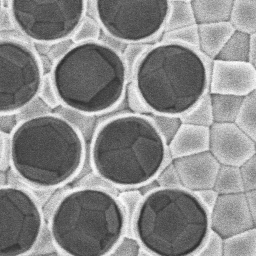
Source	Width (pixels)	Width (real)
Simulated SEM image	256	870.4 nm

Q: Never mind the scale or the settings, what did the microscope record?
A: holes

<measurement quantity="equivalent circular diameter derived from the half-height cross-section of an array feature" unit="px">69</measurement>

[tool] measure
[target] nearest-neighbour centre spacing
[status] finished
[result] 279 nanometers